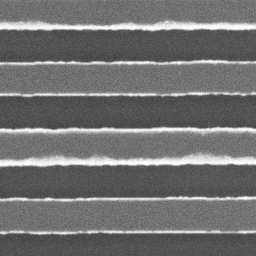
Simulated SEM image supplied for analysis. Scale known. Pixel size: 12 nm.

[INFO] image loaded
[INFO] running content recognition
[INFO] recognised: lines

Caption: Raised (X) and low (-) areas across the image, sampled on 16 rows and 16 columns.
XXXXXXXXXXXXXXXX
XXXXXXXXXXXXXXXX
----------------
----------------
XXXXXXXXXXXXXXXX
XXXXXXXXXXXXXXXX
----------------
----------------
XXXXXXXXXXXXXXXX
XXXXXXXXXXXXXXXX
----------------
----------------
XXXXXXXXXXXXXXXX
XXXXXXXXXXXXXXXX
XXXXXXXXXXXXXXXX
----------------